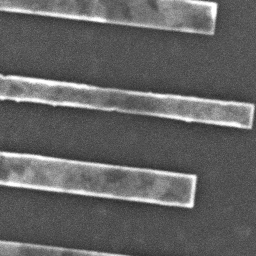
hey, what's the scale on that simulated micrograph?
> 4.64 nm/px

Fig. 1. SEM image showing one or a few lines or trenches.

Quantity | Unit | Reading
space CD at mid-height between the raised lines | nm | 262